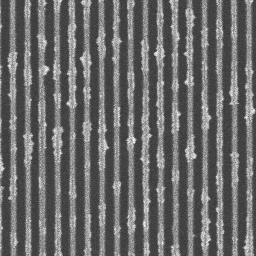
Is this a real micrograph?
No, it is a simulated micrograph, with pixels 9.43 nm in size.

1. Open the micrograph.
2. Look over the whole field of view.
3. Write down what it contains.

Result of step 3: parallel lines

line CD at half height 64.8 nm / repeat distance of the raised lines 0.139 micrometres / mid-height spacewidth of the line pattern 74.2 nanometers